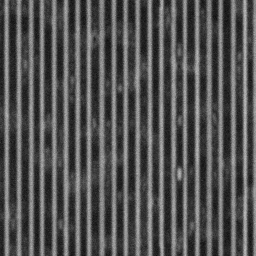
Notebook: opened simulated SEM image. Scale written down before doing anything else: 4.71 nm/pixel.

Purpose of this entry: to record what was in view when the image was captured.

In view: parallel lines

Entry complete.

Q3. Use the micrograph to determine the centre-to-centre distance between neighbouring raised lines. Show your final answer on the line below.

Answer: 56.2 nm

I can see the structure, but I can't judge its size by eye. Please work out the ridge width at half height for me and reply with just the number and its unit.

15.3 nm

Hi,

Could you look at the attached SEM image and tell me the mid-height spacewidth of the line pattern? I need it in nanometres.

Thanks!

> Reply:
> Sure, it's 41.8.